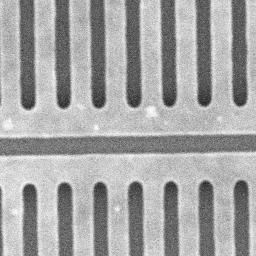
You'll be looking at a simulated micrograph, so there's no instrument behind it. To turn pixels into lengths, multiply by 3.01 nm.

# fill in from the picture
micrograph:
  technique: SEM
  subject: groups of lines, slits or small figures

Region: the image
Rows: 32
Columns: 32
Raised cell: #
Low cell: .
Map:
##..###..##..###..##..##..###..#
##..###..##..###..##..##..###..#
##..###..##..###..##..##..###..#
##..###..##..###..##..##...##..#
##..###..##..###..##..##...##..#
##...##..##..###..##..##...##..#
##...##..##..###..##..##...##..#
##...##..##..###..##..##...##..#
##...##..##..###..##..##...##..#
##...##..##..###..##..###..##..#
##...##..##..###..##..###..##..#
##...##..##..###..##..###..##..#
##...##..##..###..##..###.###..#
###.########.###################
################################
################################
################################
................................
................................
..........######################
################################
################################
################################
###..##..###.###..###.###..##..#
###..##..###..##..##..###..##..#
###..##..###..##..##..###..##..#
###..##..###..##..##..###..##..#
###..##..###..##..##..###..##..#
###..##..###..##..##..###..##..#
###..##..###..##..##..###..##..#
###..##..###..##..##..###..##..#
###..##..###..##..##...##..##..#